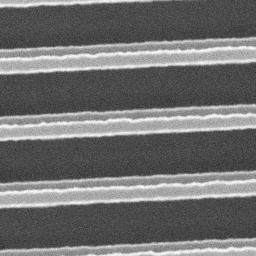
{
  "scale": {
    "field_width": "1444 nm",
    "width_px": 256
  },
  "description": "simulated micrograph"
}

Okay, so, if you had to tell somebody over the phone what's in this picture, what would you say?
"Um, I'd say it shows lines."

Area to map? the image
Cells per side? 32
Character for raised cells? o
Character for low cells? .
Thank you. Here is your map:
ooooooo.........................
................................
................................
................................
................................
................oooooooooooooooo
oooooooooooooooooooooooooooooooo
oooooooooooooooooooooooooooooooo
ooooooooooooooo.................
................................
................................
................................
................................
.......................ooooooooo
.....ooooooooooooooooooooooooooo
oooooooooooooooooooooooooooooooo
ooooooooooooooooooo.............
................................
................................
................................
................................
...............................o
...........ooooooooooooooooooooo
oooooooooooooooooooooooooooooooo
oooooooooooooooooooooooooooo....
ooooooo.........................
................................
................................
................................
................................
..................oooooooooooooo
oooooooooooooooooooooooooooooooo